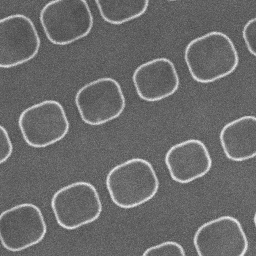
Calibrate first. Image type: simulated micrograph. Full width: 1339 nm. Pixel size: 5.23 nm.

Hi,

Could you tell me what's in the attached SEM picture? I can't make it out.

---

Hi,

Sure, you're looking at raised bodies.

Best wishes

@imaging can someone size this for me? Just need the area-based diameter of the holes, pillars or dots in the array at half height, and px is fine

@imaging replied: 45.8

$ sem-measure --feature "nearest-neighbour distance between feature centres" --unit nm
313